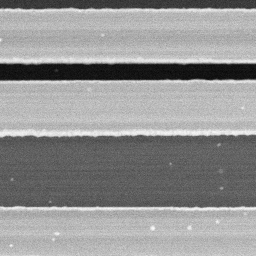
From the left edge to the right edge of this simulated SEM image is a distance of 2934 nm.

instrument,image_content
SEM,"lines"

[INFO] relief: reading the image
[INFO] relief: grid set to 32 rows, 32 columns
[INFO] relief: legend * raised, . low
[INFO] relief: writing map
................................
********************************
********************************
********************************
********************************
********************************
********************************
********************************
................................
................................
********************************
********************************
********************************
********************************
********************************
********************************
********************************
................................
................................
................................
................................
................................
................................
................................
................................
................................
********************************
********************************
********************************
********************************
********************************
********************************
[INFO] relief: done